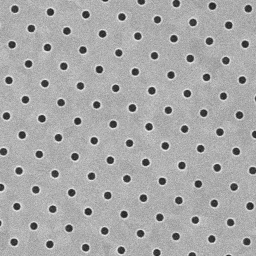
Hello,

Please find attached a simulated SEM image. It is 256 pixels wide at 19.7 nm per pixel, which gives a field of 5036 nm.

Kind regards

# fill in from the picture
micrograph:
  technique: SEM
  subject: a regular array of holes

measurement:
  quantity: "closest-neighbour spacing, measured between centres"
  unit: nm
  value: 491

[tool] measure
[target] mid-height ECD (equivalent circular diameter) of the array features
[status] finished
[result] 163 nm